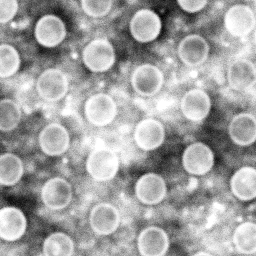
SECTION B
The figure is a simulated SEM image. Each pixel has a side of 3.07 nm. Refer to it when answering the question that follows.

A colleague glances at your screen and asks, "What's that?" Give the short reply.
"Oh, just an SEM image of a regular array of raised bodies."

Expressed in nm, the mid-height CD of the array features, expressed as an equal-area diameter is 89.8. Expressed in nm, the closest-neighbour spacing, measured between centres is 166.